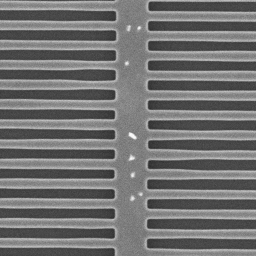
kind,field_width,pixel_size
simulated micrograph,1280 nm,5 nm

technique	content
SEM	groups of lines, slits or small figures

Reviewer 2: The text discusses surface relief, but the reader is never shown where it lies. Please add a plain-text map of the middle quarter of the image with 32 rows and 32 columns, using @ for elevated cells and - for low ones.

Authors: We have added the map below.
@@@@@@@@@@@@@@@@@@@@@-----------
------------@@@@@@@@@-----------
-------------@@@@@@@@@@@@@@@@@@@
-------------@@@@@@@@@@@@@@@@@@@
@@@@@@@@@@@@@@@@@@@@@-----------
@@@@@@@@@@@@@@@@@@@@@-----------
------------@@@@@@@@@-----------
-------------@@@@@@@@@@@@@@@@@@@
-------------@@@@@@@@@@@@@@@@@@@
@@@@@@@@@@@@@@@@@@@@@-----------
@@@@@@@@@@@@@@@@@@@@@-----------
------------@@@@@@@@@@----------
-------------@@@@@@@@@@@@@@@@@@@
-------------@@@@@@@@@@@@@@@@@@@
@@@@@@@@@@@@@@@@@@@@@-----------
@@@@@@@@@@@@@@@@@@@@@-----------
------------@@@@@@@@@@----------
-------------@@@@@@@@@@@@@@@@@@@
-------------@@@@@@@@@@@@@@@@@@@
@@@@@@@@@@@@@@@@@@@@@-----------
@@@@@@@@@@@@@@@@@@@@@-----------
------------@@@@@@@@@@@@@@@@@---
-------------@@@@@@@@@@@@@@@@@@@
-------------@@@@@@@@@@@@@@@@@@@
@@@@@@@@@@@@@@@@@@@@@-----------
@@@@@@@@@@@@@@@@@@@@@-----------
------------@@@@@@@@@@@@@@@@@---
-------------@@@@@@@@@@@@@@@@@@@
------------@@@@@@@@@@@@@@@@@@@@
@@@@@@@@@@@@@@@@@@@@@-----------
@@@@@@@@@@@@@@@@@@@@@-----------
------------@@@@@@@@@@@@@@@@@@--